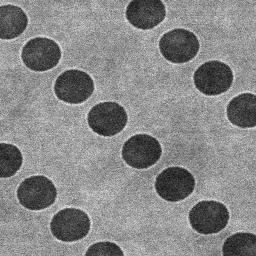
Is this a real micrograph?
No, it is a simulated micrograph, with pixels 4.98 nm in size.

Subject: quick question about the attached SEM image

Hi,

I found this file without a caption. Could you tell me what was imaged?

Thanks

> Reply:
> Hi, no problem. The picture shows a regular array of holes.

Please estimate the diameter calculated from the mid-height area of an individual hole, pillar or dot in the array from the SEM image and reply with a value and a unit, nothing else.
191 nanometres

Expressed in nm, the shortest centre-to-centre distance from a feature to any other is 231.